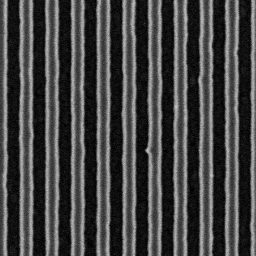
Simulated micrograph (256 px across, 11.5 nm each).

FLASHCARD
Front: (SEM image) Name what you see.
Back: parallel lines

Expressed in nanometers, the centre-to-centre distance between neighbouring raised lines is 294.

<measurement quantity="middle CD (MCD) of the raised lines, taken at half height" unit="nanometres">123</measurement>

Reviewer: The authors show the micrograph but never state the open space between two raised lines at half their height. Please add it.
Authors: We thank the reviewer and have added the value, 0.171 microns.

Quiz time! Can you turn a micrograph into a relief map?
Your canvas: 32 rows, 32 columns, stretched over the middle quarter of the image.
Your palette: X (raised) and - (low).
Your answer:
--XXX----XX----XXX----XX----XX--
--XXX----XX----XXX----XX----XX--
--XXX----XX----XXX----XX----XX--
--XXX----XX----XXX----XX----XX--
--XXX----XX----XX-----XX----XX--
--XXX----XX----XXX----XX----XX--
--XX-----XX----XXX----XX----XX--
--XXX----XX----XXX---XXX----XX--
--XXX----XX----XXX---XXX----XX--
--XXX----XX----XX----XXX----XX--
--XXX----XX----XX-----XX----XX--
--XXX----XX----XX-----XX----XX--
--XXX----XX----XXX----XX----XX--
--XXX----XX----XXX----XX----XX--
--XXX----XX----XXX----XX----XX--
--XXX----XX----XXX----XX----XX--
--XXX----XX----XXX----XX----XX--
--XXX----XX----XXX----XX----XX--
--XXX----XX----XXX----XX----XX--
--XXX----XX----XXX---XXX----XX--
--XXX----XX----XXX---XXX----XX--
--XXX----XX----XXX---XXX----XX--
--XXX----XX----XXX---XXX----XX--
--XXX----XX----XXX----XX----XX--
--XXX----XX----XX-----XX----XX--
--XXX----XX----XX-----XX----XX--
--XXX----XX----XXX----XX----XX--
--XXX----XX----XXX----XX----XX--
--XXX----XX----XXX----XX----XX--
--XXX----XX----XXX----XX----XX--
--XXX----XX----XXX----XX----XX--
--XXX----XX----XXX----XX----XX--